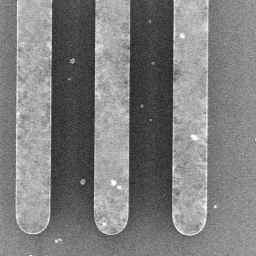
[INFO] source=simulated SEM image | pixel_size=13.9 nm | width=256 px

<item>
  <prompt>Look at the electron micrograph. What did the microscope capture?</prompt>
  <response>groups of lines, slits or small figures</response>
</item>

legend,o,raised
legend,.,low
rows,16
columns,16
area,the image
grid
.oo...oo...oo...
.oo...oo...oo...
.oo...oo...oo...
.oo...oo...oo...
.oo...oo...oo...
.oo...oo...oo...
.oo...oo...oo...
.oo...oo...oo...
.oo...oo...oo...
.oo...oo...oo...
.oo...oo...oo...
.oo...oo...oo...
.oo...oo...oo...
.oo...oo...oo...
...........o....
................